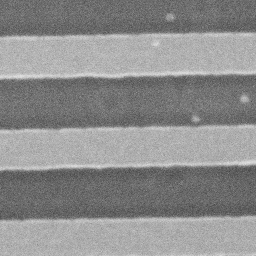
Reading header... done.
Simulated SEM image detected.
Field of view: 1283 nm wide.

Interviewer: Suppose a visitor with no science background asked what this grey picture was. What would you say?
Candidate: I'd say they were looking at lines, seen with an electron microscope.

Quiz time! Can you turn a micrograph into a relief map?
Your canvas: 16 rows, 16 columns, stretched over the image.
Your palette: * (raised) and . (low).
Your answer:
................
................
****************
****************
****************
................
................
................
****************
****************
****............
................
................
................
****************
****************